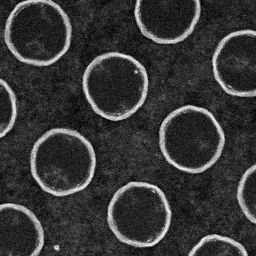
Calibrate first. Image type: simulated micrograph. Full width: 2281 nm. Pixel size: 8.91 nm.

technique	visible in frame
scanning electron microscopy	raised bodies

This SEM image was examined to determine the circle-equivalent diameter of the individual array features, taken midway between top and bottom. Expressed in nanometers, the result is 550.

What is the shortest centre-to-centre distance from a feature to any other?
822 nm